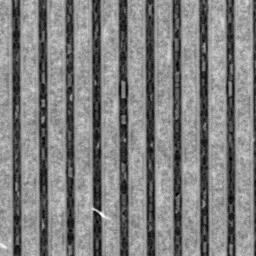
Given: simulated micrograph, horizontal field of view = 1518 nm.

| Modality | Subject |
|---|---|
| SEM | parallel lines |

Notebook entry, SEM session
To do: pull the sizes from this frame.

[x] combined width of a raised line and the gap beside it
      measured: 159 nm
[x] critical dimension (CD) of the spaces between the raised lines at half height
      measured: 60.7 nanometres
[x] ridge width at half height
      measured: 96.3 nanometres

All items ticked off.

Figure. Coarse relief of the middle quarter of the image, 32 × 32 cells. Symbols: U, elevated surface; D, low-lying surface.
DDDUUUUDDDUUUDDDUUUUDDDUUUUDDDUU
DDDUUUUDDDUUUDDDUUUUDDDUUUUDDDUU
DDDUUUUDDDUUUDDDUUUUDDDUUUUDDDUU
DDDUUUUDDDUUUDDDUUUUDDDUUUUDDDUU
DDDUUUUDDDUUUDDDUUUUDDDUUUUDDDUU
DDDUUUUDDDUUUDDDUUUUDDDUUUUDDDUU
DDDUUUUDDDUUUDDDUUUUDDDUUUUDDDUU
DDDUUUUDDDUUUDDDUUUUDDDUUUUDDDUU
DDDUUUUDDDUUUDDDUUUUDDDUUUUDDDUU
DDDUUUUDDDUUUDDDUUUUDDDUUUUDDDUU
DDDUUUUDDDUUUDDDUUUUDDDUUUUDDDUU
DDDUUUUDDDUUUDDDUUUUDDDUUUUDDDUU
DDDUUUUDDDUUUUDDUUUUDDDUUUUDDDUU
DDDUUUUDDDUUUUDDUUUUDDDUUUUDDDUU
DDDUUUUDDDUUUUDDUUUUDDDUUUUDDDUU
DDDUUUUDDDUUUUDDUUUUDDDUUUUDDDUU
DDDUUUUDDDUUUUDDUUUUDDDUUUUDDDUU
DDDUUUUDDDUUUUDDUUUUDDDUUUUDDDUU
DDDUUUUDDDUUUUDDUUUUDDDUUUUDDDUU
DDDUUUUDDDUUUUDDUUUUDDDUUUUDDDUU
DDDUUUUDDDUUUUDDUUUUDDDUUUUDDDUU
DDDUUUUDDDUUUUDDUUUUDDDUUUUDDDUU
DDDUUUUDDDUUUUDDUUUUDDDUUUUDDDUU
DDDUUUUDDDUUUUDDUUUUDDDUUUUDDDUU
DDDUUUUDDDUUUUDDUUUUDDDUUUUDDDUU
DDDUUUUDDDUUUUDDUUUUDDDUUUUDDDUU
DDDUUUUDDDUUUUDDUUUUDDDUUUUDDDUU
DDDUUUUDDDUUUUDDUUUUDDDUUUUDDDUU
DDDUUUUDDDUUUUDDUUUUDDDUUUUDDDUU
DDDUUUUDDDUUUUDDUUUUDDDUUUUDDDUU
DDDUUUUDDDUUUUDDUUUUDDDUUUUDDDUU
DDDUUUUDDDUUUUDDUUUUDDDUUUUDDDUU